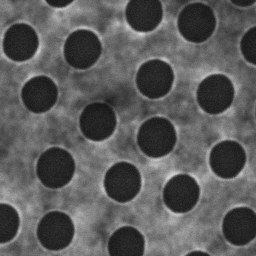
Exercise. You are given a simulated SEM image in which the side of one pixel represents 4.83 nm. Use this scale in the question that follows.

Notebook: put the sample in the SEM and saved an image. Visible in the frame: a regular array of holes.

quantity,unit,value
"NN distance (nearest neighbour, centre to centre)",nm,284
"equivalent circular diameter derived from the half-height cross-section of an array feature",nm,192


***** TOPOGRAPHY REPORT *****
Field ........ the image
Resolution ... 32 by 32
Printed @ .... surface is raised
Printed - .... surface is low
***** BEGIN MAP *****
@@@@@@---@@@@@@@----@@@@--@@@---
@@@@@@@@@@@@@@@@----@@@----@@@@@
@@@@@@@@@@@@@@@@----@@-----@@@@@
@---@@@@@@@@@@@@----@@-----@@@@-
-----@@@@---@@@@@@@@@@@---@@@@--
-----@@@-----@@@@@@@@@@@@@@@@@--
-----@@@-----@@@@@@@@@@@@@@@@@--
@--@@@@@----@@@@@@@-@@@@@@@@@@@-
@@@@@@@@@--@@@@@@----@@@@@@@@@@@
@@@@--@@@@@@@@@@@-----@@@@--@@@@
@@@----@@@@@@@@@@-----@@@----@@@
@@@----@@@@@@@@@@----@@@@----@@@
@@@----@@@@@@@@@@@@@@@@@@----@@@
@@@---@@@@@---@@@@@@@@@@@----@@@
@@@@@@@@@@-----@@@@@@@@@@@@@@@@@
@@@@@@@@@@-----@@@----@@@@@@@@@@
@@@@@@@@@@----@@@-----@@@@@@@@@@
@@@@@@@@@@@--@@@@-----@@@@@@-@@@
@@@@@@--@@@@@@@@@-----@@@@@---@@
@@@@@----@@@@@@@@@---@@@@@-----@
@@@@@----@@@@@---@@@@@@@@@-----@
@@@@@----@@@@----@@@@@@@@@@---@@
@@@@@----@@@@-----@@@---@@@@@@@@
@@@@@@--@@@@@-----@@-----@@@@@@@
@@@@@@@@@@@@@@---@@@-----@@@@@@@
-@@@@@@@@@@@@@@@@@@@@----@@@@@@@
--@@@@--@@@@@@@@@@@@@@-@@@@@----
--@@@----@@@@@@@@@@@@@@@@@@@----
--@@@----@@@@@@--@@@@@@@@@@@----
--@@@----@@@@@----@@@@@@@@@@----
@@@@@----@@@@-----@@@@@@@@@@@--@
@@@@@@@@@@@@@-----@@@@@@--@@@@@@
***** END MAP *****